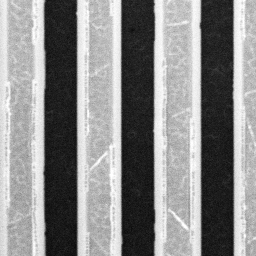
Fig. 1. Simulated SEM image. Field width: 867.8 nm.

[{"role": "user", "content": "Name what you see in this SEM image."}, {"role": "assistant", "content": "one or a few lines or trenches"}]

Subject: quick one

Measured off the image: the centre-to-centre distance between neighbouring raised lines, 78.2 pixels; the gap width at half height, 0.14 µm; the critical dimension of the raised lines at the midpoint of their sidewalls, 36.3 px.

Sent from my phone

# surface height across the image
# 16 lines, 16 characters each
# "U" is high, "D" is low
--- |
UUDDDUUDDDUUDDDU
UUDDDUUDDDUUDDDU
UUDDDUUDDDUUDDDU
UUDDDUUDDDUUDDDU
UUDDDUUDDDUUDDDU
UUDDDUUDDDUUDDDU
UUDDDUUDDDUUDDDU
UUDDDUUDDDUUDDDU
UUDDDUUDDDUUDDDU
UUDDDUUDDDUUDDDU
UUDDDUUDDDUUDDDU
UUDDDUUDDDUUDDDU
UUDDDUUDDDUUDDDU
UUDDDUUDDDUUDDDU
UUDDDUUDDDUUDDDU
UUDDDUUDDDUUDDDU